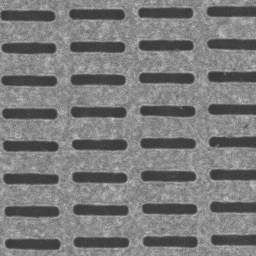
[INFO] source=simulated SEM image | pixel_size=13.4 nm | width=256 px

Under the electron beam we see a regular array of holes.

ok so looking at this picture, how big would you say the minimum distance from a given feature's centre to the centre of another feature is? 437 nm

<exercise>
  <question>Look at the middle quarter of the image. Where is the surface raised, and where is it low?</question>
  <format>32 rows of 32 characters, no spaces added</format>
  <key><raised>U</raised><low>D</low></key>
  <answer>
UUUUUUUUUUUUUUUUUUUUUUUUUUUUUUUU
UUUUUUUUUUUUUUUUUUUUUUUUUUUUUUUU
UUUDDDDUUUUDDDUUUUUDDDDDDDDDDDDD
UUDDDDDDDDDDDDDUUUUDDDDDDDDDDDDD
UUDDDDDDDDDDDDDDUUUDDDDDDDDDDDDD
UUUUUUUUUUUUUUUUUUUUUUUUUUUUUUUU
UUUUUUUUUUUUUUUUUUUUUUUUUUUUUUUU
UUUUUUUUUUUUUUUUUUUUUUUUUUUUUUUU
UUUUUUUUUUUUUUUUUUUUUUUUUUUUUUUU
UUUUUUUUUUUUUUUUUUUUUUUUUUUUUUUU
UUUUUUUUUUUUUUUUUUUDDDDDDDDDUUDD
UUDDDDDDDDDDDDDDUUUDDDDDDDDDDDDD
UUDDDDDDDDDDDDDDUUUDDDDDDDDDDDDD
UUUDDDDDUUUUDDDUUUUUUUUUUUUUUDUU
UUUUUUUUUUUUUUUUUUUUUUUUUUUUUUUU
UUUUUUUUUUUUUUUUUUUUUUUUUUUUUUUU
UUUUUUUUUUUUUUUUUUUUUUUUUUUUUUUU
UUUUUUUUUUUUUUUUUUUUUUUUUUUUUUUU
UUUUUUUUUUUUUUUUUUUUDDDUUDDDDDDU
UUDDDDDDDDDDDDDDUUUDDDDDDDDDDDDD
UUDDDDDDDDDDDDDDUUUDDDDDDDDDDDDD
UUUDDDDDDDDDDDDUUUUUUUUUUUUUUUUU
UUUUUUUUUUUUUUUUUUUUUUUUUUUUUUUU
UUUUUUUUUUUUUUUUUUUUUUUUUUUUUUUU
UUUUUUUUUUUUUUUUUUUUUUUUUUUUUUUU
UUUUUUUUUUUUUUUUUUUUUUUUUUUUUUUU
UUUUUUUUUUUUUUUUUUUUUDUUUUUUUUUU
UUDDDDDDDDDDDDDUUUUDDDDDDDDDDDDD
UUDDDDDDDDDDDDDDUUUDDDDDDDDDDDDD
UUUDDDDDDDDDDDDDUUUUDDUUUUDDDDDD
UUUUUUUUUUUUUUUUUUUUUUUUUUUUUUUU
UUUUUUUUUUUUUUUUUUUUUUUUUUUUUUUU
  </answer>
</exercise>